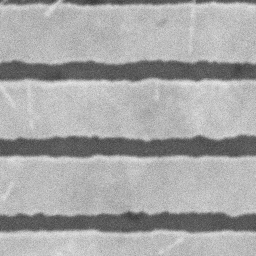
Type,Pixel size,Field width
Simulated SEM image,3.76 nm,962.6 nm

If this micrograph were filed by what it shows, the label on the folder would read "lines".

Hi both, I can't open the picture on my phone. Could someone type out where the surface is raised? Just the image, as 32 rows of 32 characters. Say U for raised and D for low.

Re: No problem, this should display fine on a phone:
DDDDDDDUDDDDDDDDDDDDDDDUDDUUDUUD
UUUUUUUUUUUUUUUUUUUUUUUUUUUUUUUU
UUUUUUUUUUUUUUUUUUUUUUUUUUUUUUUU
UUUUUUUUUUUUUUUUUUUUUUUUUUUUUUUU
UUUUUUUUUUUUUUUUUUUUUUUUUUUUUUUU
UUUUUUUUUUUUUUUUUUUUUUUUUUUUUUUU
UUUUUUUUUUUUUUUUUUUUUUUUUUUUUUUU
UUUUUUUUUUUUUUUUUUDDUDUUUDUUUUUU
DDDDDDDDDDDDDDDDDDDDDDDDDDDDDDDD
DDDDDDDDDDDDDDDDDDDDDDDDDDDDDDDD
UUUUUUUUUUUUUUUUUUUUUUUUUUUUUUUU
UUUUUUUUUUUUUUUUUUUUUUUUUUUUUUUU
UUUUUUUUUUUUUUUUUUUUUUUUUUUUUUUU
UUUUUUUUUUUUUUUUUUUUUUUUUUUUUUUU
UUUUUUUUUUUUUUUUUUUUUUUUUUUUUUUU
UUUUUUUUUUUUUUUUUUUUUUUUUUUUUUUU
UUUUUUUUUUUUUUUUUUUUUUUUUUUUUUUU
DDDDDDDDDDDDDDDDDDUDDDDDDDDDDDDD
DDDDDDDDDDDDDDDDDDDDDDDDDDDDDDDD
DDDDDDDDDDDDDDDDDDDDDDDDDDDDDDDD
UUUUUUUUUUUUUUUUUUUUUUUUUUUUUUUU
UUUUUUUUUUUUUUUUUUUUUUUUUUUUUUUU
UUUUUUUUUUUUUUUUUUUUUUUUUUUUUUUU
UUUUUUUUUUUUUUUUUUUUUUUUUUUUUUUU
UUUUUUUUUUUUUUUUUUUUUUUUUUUUUUUU
UUUUUUUUUUUUUUUUUUUUUUUUUUUUUUUU
UUUUUUUUUUUUUUUUDDUUDUUUUUDDUUUU
DDDDDDDDDDDDDDDDDDDDDDDDDDDDDDDD
DDDDDDDDDDDDDDDDDDDDDDDDDDDDDDDD
UUUUUUUUUUUUUUUUUUUUUUUUUUUUUUUU
UUUUUUUUUUUUUUUUUUUUUUUUUUUUUUUU
UUUUUUUUUUUUUUUUUUUUUUUUUUUUUUUU